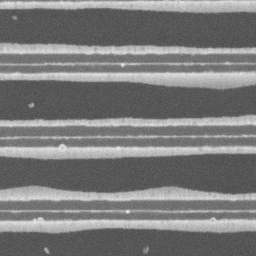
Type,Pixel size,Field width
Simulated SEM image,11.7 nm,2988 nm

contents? lines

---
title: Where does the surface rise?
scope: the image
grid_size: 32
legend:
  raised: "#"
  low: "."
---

################################
................................
................................
................................
................................
................................
################################
################################
################################
...........##.#.################
................................
................................
................................
................................
................................
....##.#########################
################################
################################
################################
................................
................................
................................
................................
................................
..####............######........
################################
################################
################################
................................
................................
................................
................................